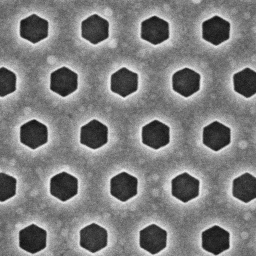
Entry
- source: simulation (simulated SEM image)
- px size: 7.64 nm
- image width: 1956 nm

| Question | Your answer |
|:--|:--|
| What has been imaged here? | a regular array of holes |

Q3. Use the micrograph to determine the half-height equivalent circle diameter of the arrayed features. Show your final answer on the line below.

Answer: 222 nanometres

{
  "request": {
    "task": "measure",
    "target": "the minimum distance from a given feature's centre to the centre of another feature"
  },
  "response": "60 pixels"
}